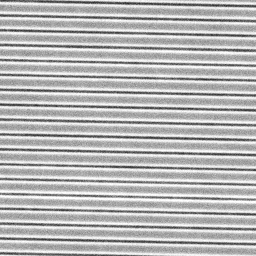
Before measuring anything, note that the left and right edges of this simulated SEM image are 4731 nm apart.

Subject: parallel lines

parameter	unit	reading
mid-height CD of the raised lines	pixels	11.6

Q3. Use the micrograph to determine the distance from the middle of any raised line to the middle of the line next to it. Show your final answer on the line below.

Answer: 14.9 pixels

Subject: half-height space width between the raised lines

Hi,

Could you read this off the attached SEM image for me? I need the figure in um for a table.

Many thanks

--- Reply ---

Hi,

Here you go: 0.067